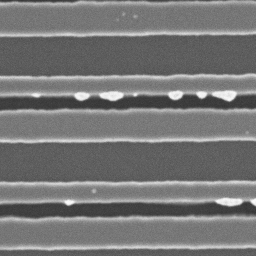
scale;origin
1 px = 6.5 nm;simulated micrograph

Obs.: lines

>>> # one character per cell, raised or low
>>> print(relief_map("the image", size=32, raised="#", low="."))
################################
################################
################################
################################
...#............................
................................
................................
................................
................................
.....................###########
################################
################################
..........#...#.............#...
................................
################################
################################
################################
###############.######..##......
................................
................................
................................
................................
................................
################################
################################
........#...................##..
................................
################################
################################
################################
################################
................................